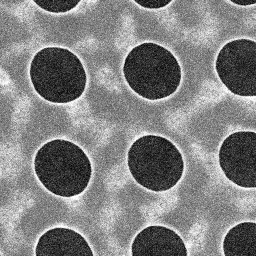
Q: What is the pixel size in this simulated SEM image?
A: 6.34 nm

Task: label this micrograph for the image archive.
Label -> holes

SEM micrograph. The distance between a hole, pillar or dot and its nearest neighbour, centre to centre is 0.584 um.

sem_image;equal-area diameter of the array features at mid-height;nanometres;362